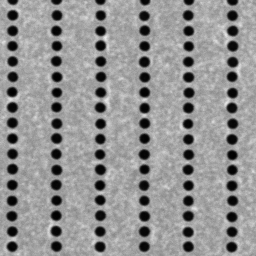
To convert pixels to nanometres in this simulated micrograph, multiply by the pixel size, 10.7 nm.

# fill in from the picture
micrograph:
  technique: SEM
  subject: a regular array of holes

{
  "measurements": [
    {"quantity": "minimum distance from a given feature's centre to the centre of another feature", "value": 15.2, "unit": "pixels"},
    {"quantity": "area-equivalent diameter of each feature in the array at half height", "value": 0.114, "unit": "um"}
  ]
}